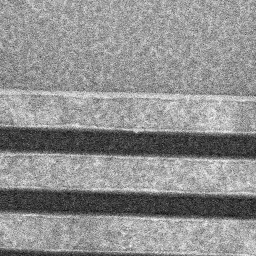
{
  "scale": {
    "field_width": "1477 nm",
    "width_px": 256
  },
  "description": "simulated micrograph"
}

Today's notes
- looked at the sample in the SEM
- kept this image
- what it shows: parallel lines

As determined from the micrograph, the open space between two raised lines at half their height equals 0.128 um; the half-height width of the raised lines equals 226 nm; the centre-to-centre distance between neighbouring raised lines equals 0.351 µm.